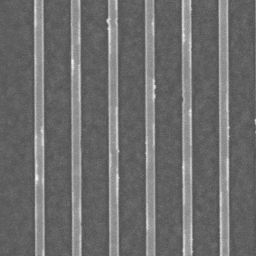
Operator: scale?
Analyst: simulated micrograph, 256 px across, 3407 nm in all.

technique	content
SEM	parallel lines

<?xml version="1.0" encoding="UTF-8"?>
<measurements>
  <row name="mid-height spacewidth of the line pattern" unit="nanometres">383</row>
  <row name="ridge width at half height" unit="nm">112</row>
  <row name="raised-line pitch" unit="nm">492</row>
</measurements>